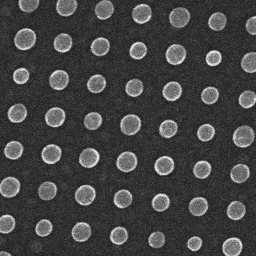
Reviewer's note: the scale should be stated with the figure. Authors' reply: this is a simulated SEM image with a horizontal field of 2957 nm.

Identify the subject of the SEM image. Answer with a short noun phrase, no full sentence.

a regular array of raised bodies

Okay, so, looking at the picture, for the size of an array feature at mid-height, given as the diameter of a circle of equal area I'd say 18.1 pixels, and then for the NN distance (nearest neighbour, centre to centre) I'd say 428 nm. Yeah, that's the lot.